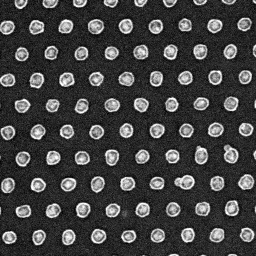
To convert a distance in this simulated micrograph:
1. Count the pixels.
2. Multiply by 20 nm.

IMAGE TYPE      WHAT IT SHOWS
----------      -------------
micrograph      a regular array of raised bodies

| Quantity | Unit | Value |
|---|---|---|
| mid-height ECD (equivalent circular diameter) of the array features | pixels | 13.1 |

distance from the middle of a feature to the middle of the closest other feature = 0.588 microns